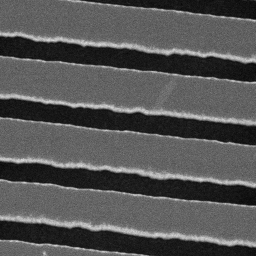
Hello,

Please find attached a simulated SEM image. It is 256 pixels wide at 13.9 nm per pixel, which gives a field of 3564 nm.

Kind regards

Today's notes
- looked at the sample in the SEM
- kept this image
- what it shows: lines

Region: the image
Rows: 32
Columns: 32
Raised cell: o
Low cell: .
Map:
ooooooooooooo...................
ooooooooooooooooooooooo.........
oooooooooooooooooooooooooooooooo
oooooooooooooooooooooooooooooooo
oooooooooooooooooooooooooooooooo
.........ooooooooooooooooooooooo
..................oooooooooooooo
oooo.........................ooo
ooooooooooooooo.................
ooooooooooooooooooooooo.........
oooooooooooooooooooooooooooooooo
oooooooooooooooooooooooooooooooo
...ooooooooooooooooooooooooooooo
...........ooooooooooooooooooooo
.....................ooooooooooo
oooooooo......................oo
ooooooooooooooooo...............
oooooooooooooooooooooooooo......
oooooooooooooooooooooooooooooooo
oooooooooooooooooooooooooooooooo
......oooooooooooooooooooooooooo
..............oooooooooooooooooo
o......................ooooooooo
ooooooooo.......................
ooooooooooooooooooo.............
ooooooooooooooooooooooooooooo...
oooooooooooooooooooooooooooooooo
oooooooooooooooooooooooooooooooo
..........oooooooooooooooooooooo
.................ooooooooooooooo
ooooo......................ooooo
oooooooooooooo..................